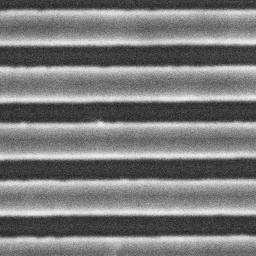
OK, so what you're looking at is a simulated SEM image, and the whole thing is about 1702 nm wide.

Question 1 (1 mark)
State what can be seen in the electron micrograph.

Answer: lines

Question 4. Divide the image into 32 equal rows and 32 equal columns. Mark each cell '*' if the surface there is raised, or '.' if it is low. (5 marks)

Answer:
................................
********************************
********************************
********************************
********************************
................................
................................
................................
.........**...******************
********************************
********************************
********************************
***********.....................
................................
................................
..**........***...**************
********************************
********************************
********************************
***************************.....
................................
................................
................................
********************************
********************************
********************************
********************************
................................
................................
................................
********************************
********************************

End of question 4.